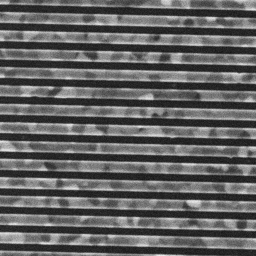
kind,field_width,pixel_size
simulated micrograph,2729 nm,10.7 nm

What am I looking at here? parallel lines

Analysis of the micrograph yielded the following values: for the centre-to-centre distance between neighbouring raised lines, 196 nm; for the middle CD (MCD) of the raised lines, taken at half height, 107 nm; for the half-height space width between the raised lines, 86.6 nm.